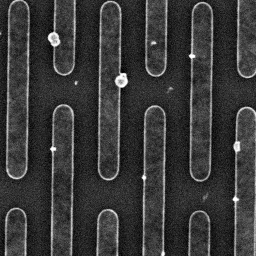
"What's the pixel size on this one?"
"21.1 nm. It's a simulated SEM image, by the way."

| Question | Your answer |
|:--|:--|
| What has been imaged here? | groups of lines, slits or small figures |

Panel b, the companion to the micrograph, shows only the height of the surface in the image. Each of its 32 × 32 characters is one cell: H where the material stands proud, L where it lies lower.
LHHLLLLHHLLLLHHLLLHHHLLLLHLLLLHH
LHHHLLLHHLLLLHHLLLHHHLLLHHHLLLHH
LHHHLLLHHLLLLHHLLLHHHLLLHHHLLLHH
LHHHLLLHHLLLLHHLLLHHHLLLHHHLLLHH
LHHHLLHHHLLLHHHLLLHHHLLLHHHLLLHH
LHHHLLHHHLLLHHHLLLHHHLLLHHHLLLHH
LHHHLLLHHLLLHHHLLLHHHLLLHHHLLLHH
LHHHLLLHHLLLHHHLLLHHHLLLHHHLLLHH
LHHHLLLHHLLLHHHLLLHHHLLLHHHLLLHH
LHHHLLLLLLLLHHHHLLLLLLLLHHLLLLHL
LHHHLLLLLLLLHHHHLLLLLLLLHHLLLLLL
LHHLLLLLLLLLHHHLLLLLLLLLHHLLLLLL
LHHLLLLLLLLLHHHLLLLLLLLLHHLLLLLL
LHHLLLLHHLLLHHHLLLLHLLLLHHLLLLHL
LHHLLLLHHLLLHHHLLLHHHLLLHHLLLLHH
LHHLLLLHHLLLHHHLLLHHHLLLHHLLLLHH
LHHLLLLHHLLLHHHLLLHHHLLLHHLLLLHH
LHHLLLLHHLLLHHHLLLHHHLLLHHLLLHHH
LHHLLLHHHLLLHHHLLLHHHLLLHHLLLHHH
LHHLLLLHHLLLHHHLLLHHHLLLHHLLLLHH
LHHLLLLHHLLLHHHLLLHHHLLLHHLLLLHH
LHHLLLLHHLLLHHHLLLHHLLLLHHLLLLHH
LLLLLLLHHLLLLLLLLLHHLLLLLLLLLLHH
LLLLLLLHHLLLLLLLLLHHLLLLLLLLLLHH
LLLLLLLHHLLLLLLLLLHHLLLLLLLLLHHH
LLLLLLLHHLLLLLLLLLHHLLLLLLLLLHHH
LHHLLLHHHLLLLHLLLLHHLLLLLLLLLHHH
LHHLLLHHHLLLHHHLLLHHLLLLHHLLLHHH
LHHLLLHHHLLLHHHLLLHHLLLLHHLLLHHH
LHHLLLHHHLLLHHHLLLHHLLLLHHLLLHHH
LHHLLLHHHLLLHHHLLLHHLLLLHHLLLHHH
LHHLLLHHHLLLHHHLLLHHLLLLHHLLLHHH